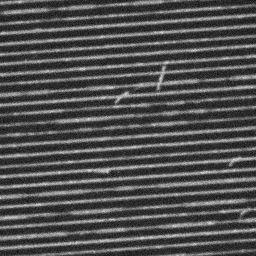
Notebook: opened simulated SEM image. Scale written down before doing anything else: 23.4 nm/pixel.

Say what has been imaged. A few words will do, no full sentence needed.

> parallel lines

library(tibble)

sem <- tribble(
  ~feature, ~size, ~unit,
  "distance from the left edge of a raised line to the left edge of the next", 0.239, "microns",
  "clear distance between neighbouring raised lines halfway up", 0.184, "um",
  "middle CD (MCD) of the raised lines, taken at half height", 0.0409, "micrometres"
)